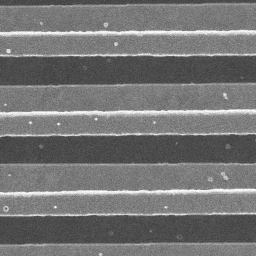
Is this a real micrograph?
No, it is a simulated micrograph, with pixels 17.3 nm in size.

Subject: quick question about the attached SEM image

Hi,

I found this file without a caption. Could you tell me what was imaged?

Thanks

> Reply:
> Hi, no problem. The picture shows lines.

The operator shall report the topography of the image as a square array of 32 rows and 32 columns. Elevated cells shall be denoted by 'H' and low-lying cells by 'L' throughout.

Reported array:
LLLLLLLLLLLLLLLLLLLLLLLLLLLLLLLL
HHHHHHHHHHHHHHHHHHHHHHHHHHHHHHHH
HHHHHHHHHHHHHHHHHHHHHHHHHHHHHHHH
HHHHHHHHHHHHHHHHHHHHHHHHHHHHHHHH
HHHHHHHHHHHHHHHHHHHHHHHHHHHHHHHH
HHHHHHHHHHHHHHHHHHHHHHHHHHHHHHHH
HHHHHHHHHHHHHHHHHHHHHHHHHHHHHHHH
LLLLLLLLLLLLLLLLLLLLLLLLLLLLLLLL
LLLLLLLLLLLLLLLLLLLLLLLLLLLLLLLL
LLLLLLLLLLLLLLLLLLLLLLLLLLLLLLLL
LLLLLLLLLLLLLLLLLLLLLLLLLLLLLLLH
HHHHHHHHHHHHHHHHHHHHHHHHHHHHHHHH
HHHHHHHHHHHHHHHHHHHHHHHHHHHHHHHH
HHHHHHHHHHHHHHHHHHHHHHHHHHHHHHHH
HHHHHHHHHHHHHHHHHHHHHHHHHHHHHHHH
HHHHHHHHHHHHHHHHHHHHHHHHHHHHHHHH
HHHHHHHHHHHHHHHHHHHHHHHHHHHHHHHH
LLLLLLLLLLLLLLLLLLLLLLLLLLLLLLLL
LLLLLLLLLLLLLLLLLLLLLLLLLLLLLLLL
LLLLLLLLLLLLLLLLLLLLLLLLLLLLLLLL
LLLLLLLLLLLLLLLLLLLLLLLLLLLLLLLL
HHHHHHHHHHHHHHHHHHHHHHHHHHHHHHHH
HHHHHHHHHHHHHHHHHHHHHHHHHHHHHHHH
HHHHHHHHHHHHHHHHHHHHHHHHHHHHHHHH
HHHHHHHHHHHHHHHHHHHHHHHHHHHHHHHH
HHHHHHHHHHHHHHHHHHHHHHHHHHHHHHHH
HHHHHHHHHHHHHHHHHHHHHHHHHHHHHHHH
LLLLLLLLLLLLLLLLLLLLLLLLLLLLLLLL
LLLLLLLLLLLLLLLLLLLLLLLLLLLLLLLL
LLLLLLLLLLLLLLLLLLLLLLLLLLLLLLLL
LLLLLLLLLLLLHLLHHHHHHHHHHHHHHHHH
HHHHHHHHHHHHHHHHHHHHHHHHHHHHHHHH